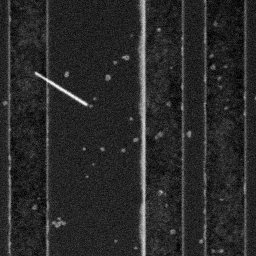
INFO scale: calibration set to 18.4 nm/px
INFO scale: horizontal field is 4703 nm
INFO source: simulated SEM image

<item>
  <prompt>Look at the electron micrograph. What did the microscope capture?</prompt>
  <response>lines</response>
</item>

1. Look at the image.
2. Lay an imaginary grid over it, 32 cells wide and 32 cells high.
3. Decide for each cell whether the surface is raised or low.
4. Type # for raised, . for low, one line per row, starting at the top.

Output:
#.....############.....###.....#
#.....############.....###.....#
#.....############.....###.....#
#.....############.....###.....#
#.....############.....###.....#
#.....############.....###.....#
#.....############.....###.....#
#.....############.....###.....#
#.....############.....###.....#
#.....############.....###.....#
#.....############.....###.....#
#.....############.....###.....#
#.....############.....###.....#
#.....############.....###.....#
#.....############.....###.....#
#.....############.....###.....#
#.....############.....###.....#
#.....############.....###.....#
#.....############.....###.....#
#.....############.....###.....#
#.....############.....###.....#
#.....############.....###.....#
#.....############.....###.....#
#.....############.....###.....#
#.....############.....###.....#
#.....############.....###.....#
#.....############.....###.....#
#.....############.....###.....#
#.....############.....###.....#
#.....############.....###.....#
#.....############.....###.....#
#.....############.....###.....#